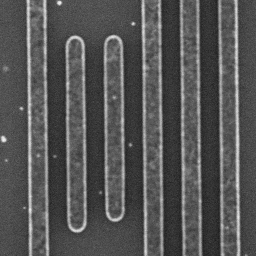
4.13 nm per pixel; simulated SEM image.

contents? groups of lines, slits or small figures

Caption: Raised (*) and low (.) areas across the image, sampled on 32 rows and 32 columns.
....**............**...**..**...
....**............**...**..***..
....**............**...**..***..
....**............**...**..***..
....**............**...**...**..
....**..**...**...**...**...**..
....**..**...**...**...**...**..
....**..**...**...**...**...**..
....**..**...**...**...**...**..
....**..**...**...**...**...**..
....**..**...**...**...**...**..
....**..**...**...**...**...**..
....**..**...**...**...**...**..
....**..**...**...**...**...**..
....**..***..**...**...**...**..
....**..***..**...**...**...**..
....**..***..**...**...**...**..
....**..***..**...**...**...**..
....**..***..**...**...**...**..
....**..***..**...**...**...**..
....**...**..**...**...**...**..
....**...**..**...**...**...**..
....**...**..**...**...**...**..
....**...**..**...**...**...**..
....**...**..**...**...**...**..
....**...**..**...**...**...**..
....**...**..**...**...**...**..
....**...**...*...**...**...**..
....**...*........**...**...**..
....**............**...**...**..
....**............**...**...**..
....**............**...**...**..